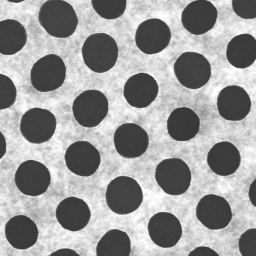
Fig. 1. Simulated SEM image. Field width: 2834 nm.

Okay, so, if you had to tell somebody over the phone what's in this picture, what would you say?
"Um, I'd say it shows a regular array of holes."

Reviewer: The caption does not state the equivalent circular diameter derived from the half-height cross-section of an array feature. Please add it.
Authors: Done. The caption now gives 394 nanometres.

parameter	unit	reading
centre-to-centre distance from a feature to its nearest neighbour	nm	585